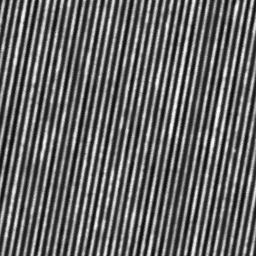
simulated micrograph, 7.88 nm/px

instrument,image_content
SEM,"parallel lines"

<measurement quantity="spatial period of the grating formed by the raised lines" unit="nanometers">56.7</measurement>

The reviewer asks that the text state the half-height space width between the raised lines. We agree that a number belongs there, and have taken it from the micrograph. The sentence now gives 0.031 µm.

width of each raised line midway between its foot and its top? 2.96 px